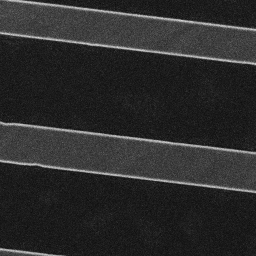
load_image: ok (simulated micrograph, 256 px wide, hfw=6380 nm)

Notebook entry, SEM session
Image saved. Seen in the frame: one or a few lines or trenches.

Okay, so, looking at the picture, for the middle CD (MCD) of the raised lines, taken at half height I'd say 921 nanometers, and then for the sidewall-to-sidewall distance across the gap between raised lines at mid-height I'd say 2200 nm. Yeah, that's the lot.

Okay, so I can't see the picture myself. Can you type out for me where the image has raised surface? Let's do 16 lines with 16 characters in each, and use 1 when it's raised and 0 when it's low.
1111100000000000
1111111111111000
0000111111111111
0000000000001111
0000000000000000
0000000000000000
0000000000000000
0000000000000000
1111111000000000
1111111111111110
0000111111111111
0000000000001111
0000000000000000
0000000000000000
0000000000000000
0000000000000000